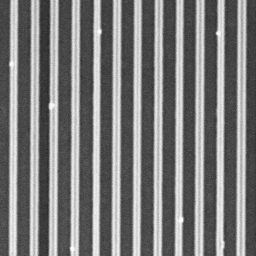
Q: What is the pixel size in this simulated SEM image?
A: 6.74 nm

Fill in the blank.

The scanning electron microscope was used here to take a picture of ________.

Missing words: parallel lines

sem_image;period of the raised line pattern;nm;140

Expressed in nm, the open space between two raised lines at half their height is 96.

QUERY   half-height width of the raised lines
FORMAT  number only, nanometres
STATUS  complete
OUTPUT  44.6